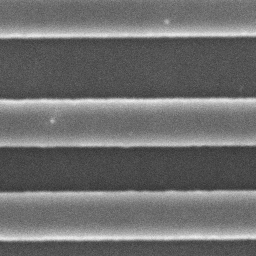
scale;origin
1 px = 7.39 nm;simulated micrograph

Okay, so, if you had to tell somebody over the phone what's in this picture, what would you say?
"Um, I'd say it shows lines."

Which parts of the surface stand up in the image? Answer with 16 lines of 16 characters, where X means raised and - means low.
XXXXXXXXXXXXXXXX
XXXXXXXXXXXXXXXX
----------------
----------------
----------------
----------------
XXXXXXXXXXXXXXXX
XXXXXXXXXXXXXXXX
XXXXXXXXXXXXXXXX
----------------
----------------
----------------
XXXXXXXXXXXXXXXX
XXXXXXXXXXXXXXXX
XXXXXXXXXXXXXXXX
----------------